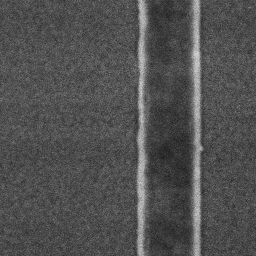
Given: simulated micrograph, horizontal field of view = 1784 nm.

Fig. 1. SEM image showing one or a few lines or trenches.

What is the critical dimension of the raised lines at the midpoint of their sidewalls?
0.397 µm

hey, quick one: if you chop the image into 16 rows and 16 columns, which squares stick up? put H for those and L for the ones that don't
LLLLLLLLLHHHLLLL
LLLLLLLLLHHHLLLL
LLLLLLLLLHHHLLLL
LLLLLLLLLHHHLLLL
LLLLLLLLLHHHLLLL
LLLLLLLLLHHHLLLL
LLLLLLLLLHHHLLLL
LLLLLLLLLHHHLLLL
LLLLLLLLLHHHLLLL
LLLLLLLLLHHHLLLL
LLLLLLLLLHHHLLLL
LLLLLLLLLHHHLLLL
LLLLLLLLLHHHLLLL
LLLLLLLLLHHHLLLL
LLLLLLLLLHHHLLLL
LLLLLLLLLHHHLLLL